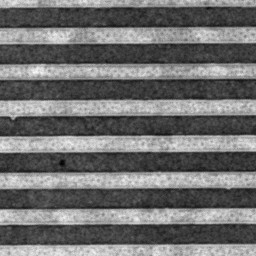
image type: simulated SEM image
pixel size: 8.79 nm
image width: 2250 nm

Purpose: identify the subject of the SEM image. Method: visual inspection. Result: parallel lines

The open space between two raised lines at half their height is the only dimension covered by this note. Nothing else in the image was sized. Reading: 197 nm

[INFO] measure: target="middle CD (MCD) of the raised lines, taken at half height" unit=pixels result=14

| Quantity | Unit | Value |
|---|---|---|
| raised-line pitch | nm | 318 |